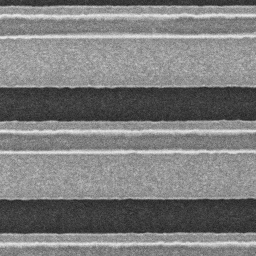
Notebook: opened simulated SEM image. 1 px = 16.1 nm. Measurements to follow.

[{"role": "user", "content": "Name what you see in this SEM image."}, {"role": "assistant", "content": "lines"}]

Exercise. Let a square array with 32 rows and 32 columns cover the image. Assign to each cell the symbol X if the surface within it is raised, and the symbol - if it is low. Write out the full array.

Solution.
--------------------------------
XXXXXXXXXXXXXXXXXXXXXXXXXXXXXXXX
XXXXXXXXXXXXXXXXXXXXXXXXXXXXXXXX
XXXXXXXXXXXXXXXXXXXXXXXXXXXXXXXX
XXXXXXXXXXXXXXXXXXXXXXXXXXXXXXXX
XXXXXXXXXXXXXXXXXXXXXXXXXXXXXXXX
XXXXXXXXXXXXXXXXXXXXXXXXXXXXXXXX
XXXXXXXXXXXXXXXXXXXXXXXXXXXXXXXX
XXXXXXXXXXXXXXXXXXXXXXXXXXXXXXXX
XXXXXXXXXXXXXXXXXXXXXXXXXXXXXXXX
XXXXXXXXXXXXXXXXXXXXXXXXXXXXXXXX
--------------------------------
--------------------------------
--------------------------------
--------------------------------
XXXXXXXXXXXXXXXXXXXXXXXXXXXXXXXX
XXXXXXXXXXXXXXXXXXXXXXXXXXXXXXXX
XXXXXXXXXXXXXXXXXXXXXXXXXXXXXXXX
XXXXXXXXXXXXXXXXXXXXXXXXXXXXXXXX
XXXXXXXXXXXXXXXXXXXXXXXXXXXXXXXX
XXXXXXXXXXXXXXXXXXXXXXXXXXXXXXXX
XXXXXXXXXXXXXXXXXXXXXXXXXXXXXXXX
XXXXXXXXXXXXXXXXXXXXXXXXXXXXXXXX
XXXXXXXXXXXXXXXXXXXXXXXXXXXXXXXX
XXXXXXXXXXXXXXXXXXXXXXXXXXXXXXXX
--------------------------------
--------------------------------
--------------------------------
--------------------------------
XXXXXXXXXXXXXXXXXXXXXXXXXXXXXXXX
XXXXXXXXXXXXXXXXXXXXXXXXXXXXXXXX
XXXXXXXXXXXXXXXXXXXXXXXXXXXXXXXX